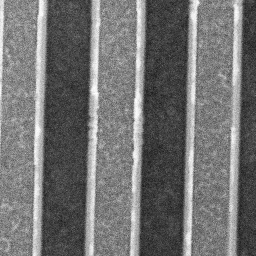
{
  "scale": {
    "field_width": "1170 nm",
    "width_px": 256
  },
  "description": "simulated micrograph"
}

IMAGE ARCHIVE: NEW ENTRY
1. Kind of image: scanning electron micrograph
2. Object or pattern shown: one or a few lines or trenches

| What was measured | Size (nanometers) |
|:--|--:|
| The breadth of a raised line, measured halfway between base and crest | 211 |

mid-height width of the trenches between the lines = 236 nanometers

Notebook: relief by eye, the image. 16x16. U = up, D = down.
UUUDDDUUUDDDUUUD
UUUDDDUUUDDDUUUD
UUUDDDUUUDDDUUUD
UUUDDDUUUDDDUUUD
UUUDDDUUUDDDUUUD
UUUDDDUUUDDDUUUD
UUDDDDUUUDDDUUUD
UUDDDDUUUDDDUUUD
UUDDDDUUUDDDUUUD
UUDDDDUUUDDDUUUD
UUDDDDUUUDDDUUUD
UUDDDDUUUDDDUUUD
UUDDDDUUDDDDUUUD
UUDDDDUUDDDDUUUD
UUDDDDUUDDDDUUUD
UUDDDDUUDDDDUUUD